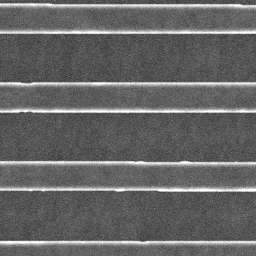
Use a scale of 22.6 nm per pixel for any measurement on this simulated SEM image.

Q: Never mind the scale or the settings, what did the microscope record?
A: lines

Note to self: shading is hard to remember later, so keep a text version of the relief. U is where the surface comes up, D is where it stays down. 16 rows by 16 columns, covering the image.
UUUUUUUUUUUUUUUU
UUUUUUUUUUUUUUUU
DDDDDDDDDDDDDDDD
DDDDDDDDDDDDDDDD
DDDDDDDDDDDDDDDD
UUUUUUUUUUUUUUUU
UUUUUUUUUUUUUUUU
DDDDDDDDDDDDDDDD
DDDDDDDDDDDDDDDD
DDDDDDDDDDDDDDDD
UUUUUUUUUUUUUUUU
UUUUUUUUUUUUUUUU
DDDDDDDDDDDDDDDD
DDDDDDDDDDDDDDDD
DDDDDDDDDDDDDDDD
UUUUUUUUUUUUUUUU